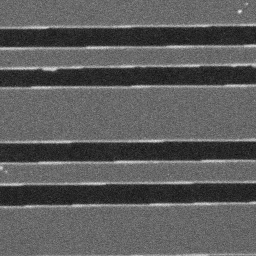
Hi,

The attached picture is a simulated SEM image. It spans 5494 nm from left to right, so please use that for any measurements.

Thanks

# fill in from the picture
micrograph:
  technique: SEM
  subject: lines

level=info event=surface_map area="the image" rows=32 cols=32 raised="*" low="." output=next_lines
********************************
********************************
********************************
******..........................
................................
................................
********************************
********************************
****............................
................................
................................
********************************
********************************
********************************
********************************
********************************
********************************
********************************
................................
................................
********************************
********************************
********************************
................................
................................
.........................*******
********************************
********************************
********************************
********************************
********************************
********************************